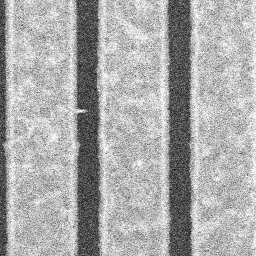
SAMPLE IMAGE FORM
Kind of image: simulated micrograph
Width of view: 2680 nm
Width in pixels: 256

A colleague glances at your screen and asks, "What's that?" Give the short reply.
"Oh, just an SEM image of one or a few lines or trenches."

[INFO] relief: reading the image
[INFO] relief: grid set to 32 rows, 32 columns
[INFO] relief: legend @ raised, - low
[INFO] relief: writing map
-@@@@@@@@----@@@@@@@----@@@@@@@@
-@@@@@@@@----@@@@@@@----@@@@@@@@
-@@@@@@@@----@@@@@@@-----@@@@@@@
-@@@@@@@@----@@@@@@@----@@@@@@@@
-@@@@@@@@----@@@@@@@----@@@@@@@@
-@@@@@@@@----@@@@@@@-----@@@@@@@
-@@@@@@@@----@@@@@@@-----@@@@@@@
-@@@@@@@@----@@@@@@@----@@@@@@@@
-@@@@@@@@----@@@@@@@----@@@@@@@@
-@@@@@@@@----@@@@@@@----@@@@@@@@
-@@@@@@@@----@@@@@@@----@@@@@@@@
-@@@@@@@@----@@@@@@@----@@@@@@@@
-@@@@@@@@----@@@@@@@----@@@@@@@@
-@@@@@@@@----@@@@@@@----@@@@@@@@
-@@@@@@@@----@@@@@@@----@@@@@@@@
-@@@@@@@@----@@@@@@@----@@@@@@@@
-@@@@@@@@----@@@@@@@----@@@@@@@@
-@@@@@@@@----@@@@@@@----@@@@@@@@
-@@@@@@@@----@@@@@@@----@@@@@@@@
-@@@@@@@@----@@@@@@@-----@@@@@@@
-@@@@@@@@----@@@@@@@----@@@@@@@@
-@@@@@@@@----@@@@@@@@----@@@@@@@
-@@@@@@@@----@@@@@@@----@@@@@@@@
--@@@@@@@----@@@@@@@@---@@@@@@@@
-@@@@@@@@----@@@@@@@@----@@@@@@@
-@@@@@@@@----@@@@@@@----@@@@@@@@
-@@@@@@@@----@@@@@@@@---@@@@@@@@
-@@@@@@@@----@@@@@@@@---@@@@@@@@
-@@@@@@@@----@@@@@@@@---@@@@@@@@
-@@@@@@@@----@@@@@@@@---@@@@@@@@
-@@@@@@@@----@@@@@@@@----@@@@@@@
-@@@@@@@@----@@@@@@@-----@@@@@@@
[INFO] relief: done